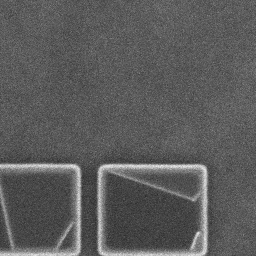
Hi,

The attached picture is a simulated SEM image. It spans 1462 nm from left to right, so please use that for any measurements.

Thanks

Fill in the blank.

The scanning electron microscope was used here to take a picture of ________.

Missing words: wiring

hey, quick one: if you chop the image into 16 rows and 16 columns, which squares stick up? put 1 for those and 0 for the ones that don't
0000000000000000
0000000000000000
0000000000000000
0000000000000000
0000000000000000
0000000000000000
0000000000000000
0000000000000000
0000000000000000
0000000000000000
1111000111110000
1111101111111000
1111101111111000
1111101111111000
1111101111111000
1111101111111000